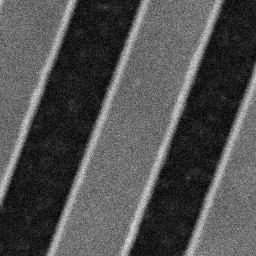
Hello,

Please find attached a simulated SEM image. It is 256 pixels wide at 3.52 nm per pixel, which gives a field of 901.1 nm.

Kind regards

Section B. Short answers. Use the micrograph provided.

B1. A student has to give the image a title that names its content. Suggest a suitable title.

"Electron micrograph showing one or a few lines or trenches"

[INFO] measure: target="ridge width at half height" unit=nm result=241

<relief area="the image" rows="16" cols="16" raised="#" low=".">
####.....####...
####.....####...
####....#####...
###.....####....
###....#####....
##.....#####....
##.....####....#
##....#####....#
#.....#####....#
#.....####....##
#....#####....##
.....####.....##
....#####....###
....#####....###
....####....####
...#####....####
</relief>